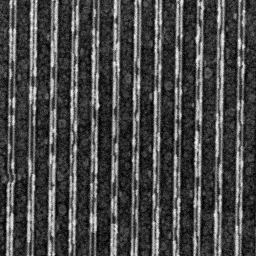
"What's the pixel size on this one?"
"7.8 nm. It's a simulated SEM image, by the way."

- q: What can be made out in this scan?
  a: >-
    parallel lines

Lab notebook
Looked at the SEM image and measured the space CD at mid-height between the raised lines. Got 0.118 um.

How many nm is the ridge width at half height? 40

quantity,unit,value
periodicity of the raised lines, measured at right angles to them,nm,162